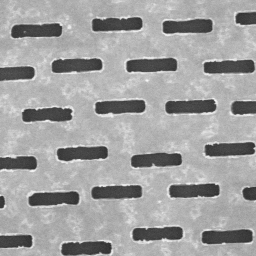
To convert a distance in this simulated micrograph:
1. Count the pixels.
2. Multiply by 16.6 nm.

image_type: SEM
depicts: a regular array of holes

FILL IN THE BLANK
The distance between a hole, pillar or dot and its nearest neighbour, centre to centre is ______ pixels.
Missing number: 53.1